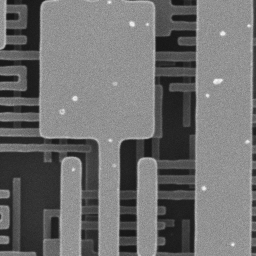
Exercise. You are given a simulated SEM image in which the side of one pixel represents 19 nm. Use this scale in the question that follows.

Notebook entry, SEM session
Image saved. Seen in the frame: wiring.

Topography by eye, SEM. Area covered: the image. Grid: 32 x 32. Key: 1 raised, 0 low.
10000111111111111110000001111111
10000111111111111110000001111111
10000111111111111110000001111111
10000111111111111110000001111111
10000111111111111110000001111111
10000111111111111110000001111111
00000111111111111110000001111111
00000111111111111110000001111111
00000111111111111110000001111111
00000111111111111110000011111111
00000111111111111110000011111111
00000111111111111110000001111111
00000111111111111110000001111111
00000111111111111110000011111111
00000111111111111110000011111110
00000111111111111110000011111110
00000111111111111110000011111110
00000000000011110000000011111110
00000000000011100000000011111110
00000000000011100000000011111110
00000000110011100111000011111110
00000000110011100111000011111110
00000000110011100111000011111110
00000000110011100111000011111110
00000000110011100111000011111110
00000000110011100111000011111110
00000000110011100111000011111110
00000000110011100111000011111110
00000000110011100111000011111110
00000000110011100111000011111110
00000000110011100111000011111110
00000000110011100110000011111110